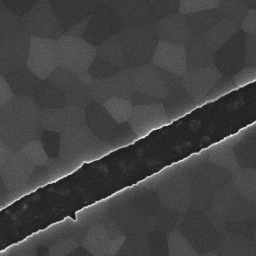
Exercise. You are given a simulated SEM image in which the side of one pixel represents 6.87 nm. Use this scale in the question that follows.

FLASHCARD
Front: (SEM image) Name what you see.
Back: one or a few lines or trenches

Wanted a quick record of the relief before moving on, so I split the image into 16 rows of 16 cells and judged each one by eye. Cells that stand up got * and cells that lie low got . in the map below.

****************
****************
****************
****************
****************
***************.
*************...
***********.....
*********.....**
*******.....****
*****.....******
***.....********
*.....**********
....************
..**************
****************